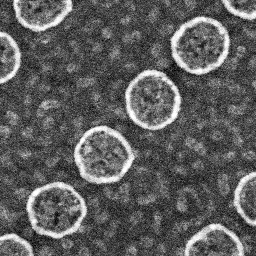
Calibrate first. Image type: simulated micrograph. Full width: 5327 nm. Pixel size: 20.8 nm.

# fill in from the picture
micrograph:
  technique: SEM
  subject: raised bodies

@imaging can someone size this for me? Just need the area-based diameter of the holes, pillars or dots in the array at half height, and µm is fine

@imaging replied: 1.1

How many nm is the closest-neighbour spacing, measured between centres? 1510